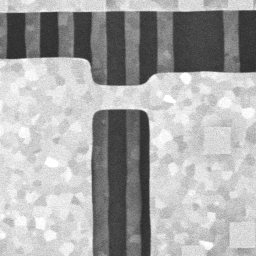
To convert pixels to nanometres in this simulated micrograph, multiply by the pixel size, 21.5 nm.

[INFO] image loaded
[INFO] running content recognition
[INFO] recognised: wiring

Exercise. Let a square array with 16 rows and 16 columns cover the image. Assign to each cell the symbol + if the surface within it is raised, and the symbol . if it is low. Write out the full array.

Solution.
++++++++++++++++
................
................
................
++++++......++..
++++++++++++++++
++++++++++++++++
++++++...+++++++
++++++...+++++++
++++++...+++++++
++++++...+++++++
++++++...+++++++
++++++...+++++++
++++++...+++++++
++++++...+++++++
++++++...+++++++